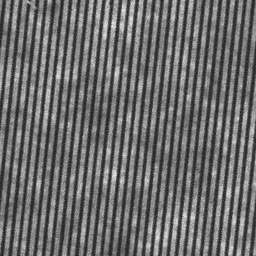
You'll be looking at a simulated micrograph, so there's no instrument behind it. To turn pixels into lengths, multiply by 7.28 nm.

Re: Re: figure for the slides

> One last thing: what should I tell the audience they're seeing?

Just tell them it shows parallel lines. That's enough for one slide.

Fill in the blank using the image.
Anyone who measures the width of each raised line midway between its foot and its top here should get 28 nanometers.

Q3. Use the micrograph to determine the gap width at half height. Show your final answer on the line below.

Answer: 0.0353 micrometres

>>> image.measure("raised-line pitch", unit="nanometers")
60.1